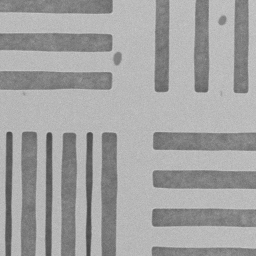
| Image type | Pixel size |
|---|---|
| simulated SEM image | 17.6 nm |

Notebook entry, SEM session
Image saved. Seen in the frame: groups of lines, slits or small figures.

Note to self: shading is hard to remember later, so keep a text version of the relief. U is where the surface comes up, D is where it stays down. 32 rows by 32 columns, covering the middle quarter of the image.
UUUUUUUUUUUUUUUUUUUUUUUDDDUUUUUU
UUUUUUUUUUUUUUUUUUUUUUDDDDUUUUUU
DDDDDDDDDDDDUUUUUUUUUUDDDDUUUUUU
DDDDDDDDDDDDUUUUUUUUUUDDDDUUUUUU
DDDDDDDDDDDDUUUUUUUUUUDDDDUUUUUU
DDDDDDDDDDDDUUUUUUUUUUDDDDUUUUUU
UUUUUDDDDDDUUUUUUUUUUUUDDDUUUUUU
UUUUUUUUUUUUUUUUUUUUUUUUUUUUUUUU
UUUUUUUUUUUUUUUUUUUUUUUUUUUUUUUU
UUUUUUUUUUUUUUUUUUUUUUUUUUUUUUUU
UUUUUUUUUUUUUUUUUUUUUUUUUUUUUUUU
UUUUUUUUUUUUUUUUUUUUUUUUUUUUUUUU
UUUUUUUUUUUUUUUUUUUUUUUUUUUUUUUU
UUUUUUUUUUUUUUUUUUUUUUUUUUUUUUUU
UUUUUUUUUUUUUUUUUUUUUUUUUUUUUUUU
UUUUUUUUUUUUUUUUUUUUUUUUUUUUUUUU
UUUUUUUUUUUUUUUUUUUUUUUUUUUUUUUU
DDDUUUDUUUDDDUUUUUUUUUDDDDDDDDDD
DDDUUDDUUDDDDUUUUUUUUUDDDDDDDDDD
DDDUUDDUUDDDDUUUUUUUUUDDDDDDDDDD
DDDUUDDUUDDDDUUUUUUUUUDDDDDDDDDD
DDDUUDDUUDDDDUUUUUUUUUUDDDDDDDDD
DDDUUDDUUDDDDUUUUUUUUUUUUUUUUUUU
DDDUUDDUUDDDDUUUUUUUUUUUUUUUUUUU
DDDUUDDUUDDDDUUUUUUUUUUUUUUUUUUU
DDDUUDDUUDDDDUUUUUUUUUUUUUUUUUUU
DDDUUDDUUDDDDUUUUUUUUUUDDDDDDDDD
DDDUUDDUUDDDDUUUUUUUUUDDDDDDDDDD
DDDUUDDUUDDDDUUUUUUUUUDDDDDDDDDD
DDDUUDDUUDDDDUUUUUUUUUDDDDDDDDDD
DDDUUDDUUDDDDUUUUUUUUUDDDDDDDDDD
DDDUUDDUUDDDDUUUUUUUUUUUUUUUUUUU